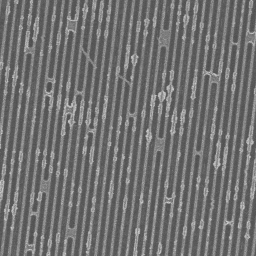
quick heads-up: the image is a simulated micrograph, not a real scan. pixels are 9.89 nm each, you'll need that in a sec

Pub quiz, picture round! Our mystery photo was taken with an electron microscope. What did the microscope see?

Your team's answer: parallel lines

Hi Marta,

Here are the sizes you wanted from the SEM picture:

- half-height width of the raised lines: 28.2 nm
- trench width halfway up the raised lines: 46.6 nm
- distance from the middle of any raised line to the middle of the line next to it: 77 nanometres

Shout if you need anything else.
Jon